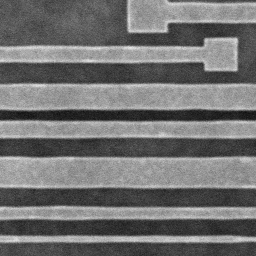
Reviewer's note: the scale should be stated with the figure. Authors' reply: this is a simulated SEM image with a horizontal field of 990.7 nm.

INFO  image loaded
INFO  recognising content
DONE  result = groups of lines, slits or small figures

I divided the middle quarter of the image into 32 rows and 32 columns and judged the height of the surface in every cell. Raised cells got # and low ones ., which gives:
................................
................................
................................
................................
................................
################################
################################
################################
################################
################################
################################
................................
................................
................................
................................
################################
################################
################################
................................
................................
................................
................................
................................
######.#####....................
################################
################################
################################
################################
################################
################################
################################
................................